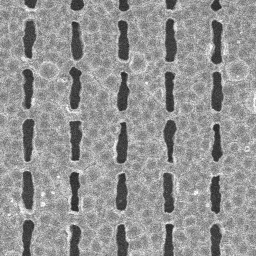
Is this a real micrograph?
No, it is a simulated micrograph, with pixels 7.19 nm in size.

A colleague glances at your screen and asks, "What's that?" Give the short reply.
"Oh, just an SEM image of a regular array of holes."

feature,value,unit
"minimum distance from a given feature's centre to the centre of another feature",0.337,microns